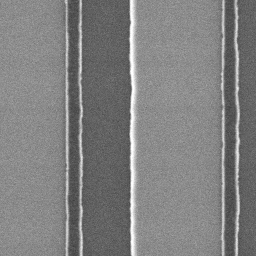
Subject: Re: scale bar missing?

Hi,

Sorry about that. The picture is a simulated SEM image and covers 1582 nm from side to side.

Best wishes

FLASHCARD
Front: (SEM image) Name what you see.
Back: lines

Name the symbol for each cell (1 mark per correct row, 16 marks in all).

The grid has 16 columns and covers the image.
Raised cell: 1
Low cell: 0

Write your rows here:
1111100011111110
1111100011111110
1111100011111110
1111100011111110
1111100011111110
1111100011111110
1111100011111110
1111100011111110
1111100011111110
1111100011111110
1111100011111110
1111100011111110
1111100011111110
1111100011111110
1111100011111110
1111100011111110